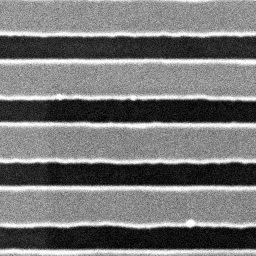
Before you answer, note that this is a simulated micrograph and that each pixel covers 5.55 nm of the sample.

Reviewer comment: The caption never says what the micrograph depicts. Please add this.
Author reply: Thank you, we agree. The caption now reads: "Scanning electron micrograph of lines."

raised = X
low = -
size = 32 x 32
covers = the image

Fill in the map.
XXXXXXXXXXXXXXXXXXXXXXXXXXXXXXXX
XXXXXXXXXXXXXXXXXXXXXXXXXXXXXXXX
XXXXXXXXXXXXXXXXXXXXXXXXXXXXXXXX
XXXXXXXXXXXXXXXXXXXXXXXXXXXXXXXX
-----X-------X-----------X------
--------------------------------
--------------------------------
XX--XXXXXXX-XXXXXXXXXXXXXXXXXX--
XXXXXXXXXXXXXXXXXXXXXXXXXXXXXXXX
XXXXXXXXXXXXXXXXXXXXXXXXXXXXXXXX
XXXXXXXXXXXXXXXXXXXXXXXXXXXXXXXX
XXXXXXXXXXXXXXXXXXXXXXXXXXXXXXXX
-----------------------------XXX
--------------------------------
--------------------------------
XXXXXXXXXXXXXXXXXXXXXXXXXXXXXXXX
XXXXXXXXXXXXXXXXXXXXXXXXXXXXXXXX
XXXXXXXXXXXXXXXXXXXXXXXXXXXXXXXX
XXXXXXXXXXXXXXXXXXXXXXXXXXXXXXXX
XXXXXXXXXXXXXXXXXXXXXXXXXXXXXXXX
--------------------------------
--------------------------------
--------------------------------
XXXXXXXXXXXXXXXXXXXXXXXXXXXXXXXX
XXXXXXXXXXXXXXXXXXXXXXXXXXXXXXXX
XXXXXXXXXXXXXXXXXXXXXXXXXXXXXXXX
XXXXXXXXXXXXXXXXXXXXXXXXXXXXXXXX
XXXXXXXXXXXXXXXXXXXXXXXXXXXXXXXX
--------------------------------
--------------------------------
--------------------------------
XXXXXXXXXXXXXXXXXXXXXXXXXXXXXXXX